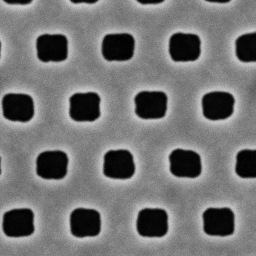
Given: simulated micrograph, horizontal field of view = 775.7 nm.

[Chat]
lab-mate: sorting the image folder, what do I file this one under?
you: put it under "a regular array of holes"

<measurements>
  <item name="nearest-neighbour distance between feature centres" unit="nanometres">201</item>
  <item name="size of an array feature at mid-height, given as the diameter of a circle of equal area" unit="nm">96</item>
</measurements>